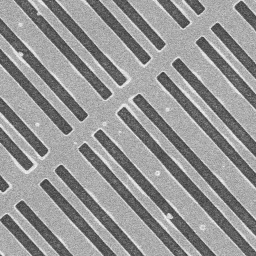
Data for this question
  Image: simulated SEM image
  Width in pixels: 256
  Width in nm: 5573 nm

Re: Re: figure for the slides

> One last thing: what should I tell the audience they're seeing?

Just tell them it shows groups of lines, slits or small figures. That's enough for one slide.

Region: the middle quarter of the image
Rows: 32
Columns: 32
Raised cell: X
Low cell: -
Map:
XX----XXX----XXXXXXXXXXXXXX----X
XXX----XXX----XXXXXXXXXXXXXX----
XXXX----XXX----XXXXXXXXX--XXX---
XXXXX----XXX----XXXXXXX---XXXX--
XXXXXX----XXX---XXXXXXXX---XXXX-
XXXXXXX----XXX-XXXXXXXXX----XXX-
-XXXXXXX----XXXXXXXXXXXXX----XXX
--XXXXXXX---XXXXXX-XXXXXXX----XX
--XXXXXXX--XXXXXX---XXXXXXX----X
---XXXXXXXXXXXXXX----XXXXXXX----
X---XXXXXXXXXXX-XX----XXXXXXX---
X----XXXXXXXXX--XXX----XXXXXXX--
XX----XXXXXXX----XXX----XXXXXXX-
XXX---XXXXXXXX----XXX----XXXXXXX
-XXXXXXXXXXXXXX----XXX----XXXXXX
--XXXXXXXXXXXXXX----XXX---XXXXXX
--XXXXXXX-XXXXXXX----XXX---XXXXX
-XXXXXX----XXXXXXX----XXX---XXXX
XXXXXXXX----XXXXXXX---XXXX---XXX
XXXXXXXXX----XXXXXXX---XXX----XX
XXXX--XXX----XXXXXXX----XXX----X
XXXX---XXX----XXXXXXX----XXX----
XXXX----XXX----XXXXXXX----XXX---
XXXXX----XXX----XXXXXXX----XXX--
XXXXXX----XXX----XXXXXXX----XXX-
XXXXXXX----XXX----XXXXXXX----XXX
-XXXXXXX----XXX----XXXXXXX----XX
--XXXXXXX----XXX----XXXXXX-----X
---XXXXXXX---XXXX----XXXXXX----X
----XXXXXXX---XXX-----XXXXXX----
X---XXXXXXXX---XXX----XXXXXXX---
XX---XXXXXXXX---XXX----XXXXXXX--